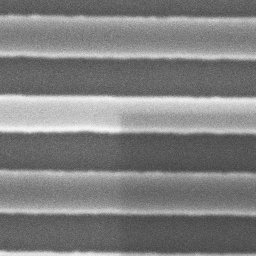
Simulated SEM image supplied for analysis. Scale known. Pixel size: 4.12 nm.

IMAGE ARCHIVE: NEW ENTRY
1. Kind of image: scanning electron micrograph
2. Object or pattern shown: lines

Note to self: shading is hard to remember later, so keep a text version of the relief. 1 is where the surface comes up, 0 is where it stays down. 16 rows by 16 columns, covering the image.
0000000000000000
1111111111111111
1111111111111111
0001011111111111
0000000000000000
0000000000000000
1111111111111111
1111111111111111
0000000000000000
0000000000000000
0000000000000000
1111111111111111
1111111111111111
0000000000000000
0000000000000000
0000000000000000